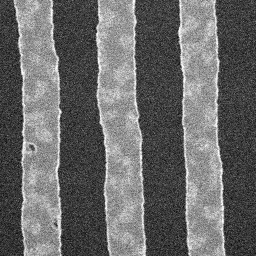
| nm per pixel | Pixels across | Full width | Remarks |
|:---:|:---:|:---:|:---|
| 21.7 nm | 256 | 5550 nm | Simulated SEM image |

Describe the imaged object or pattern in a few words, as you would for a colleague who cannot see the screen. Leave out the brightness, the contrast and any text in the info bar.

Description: one or a few lines or trenches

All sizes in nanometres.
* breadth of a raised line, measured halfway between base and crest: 753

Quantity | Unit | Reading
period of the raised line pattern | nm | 1750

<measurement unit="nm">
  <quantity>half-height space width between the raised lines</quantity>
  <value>972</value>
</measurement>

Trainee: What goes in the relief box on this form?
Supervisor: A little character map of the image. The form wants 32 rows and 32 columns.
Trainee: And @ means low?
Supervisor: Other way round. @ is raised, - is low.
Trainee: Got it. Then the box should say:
--@@@@------@@@@@------@@@@-----
--@@@@------@@@@@------@@@@-----
--@@@@-------@@@@------@@@@-----
--@@@@@-----@@@@@------@@@@-----
--@@@@------@@@@@-----@@@@@-----
--@@@@@-----@@@@@------@@@@-----
---@@@@-----@@@@@------@@@@-----
---@@@@-----@@@@@------@@@@-----
---@@@@-----@@@@@------@@@@-----
---@@@@-----@@@@@------@@@@-----
---@@@@-----@@@@@------@@@@-----
---@@@@-----@@@@@------@@@@-----
---@@@@-----@@@@@------@@@@-----
---@@@@-----@@@@@------@@@@-----
---@@@@------@@@@------@@@@-----
---@-@@------@@@@------@@@@-----
---@@@@------@@@@@-----@@@@-----
---@@@@------@@@@@-----@@@@-----
-----@@------@@@@@-----@@@@-----
---@@@@------@@@@@-----@@@@-----
---@@@@------@@@@@-----@@@@@----
---@@@@------@@@@@-----@@@@@----
---@@@@------@@@@@-----@@@@@----
---@@@@------@@@@@-----@@@@@----
---@@@@------@@@@@------@@@@----
---@@@@------@@@@@-----@@@@@----
---@@@@@-----@@@@@-----@@@@@----
---@@@-------@@@@@-----@@@@@----
---@@@@------@@@@@-----@@@@@----
---@@@@-------@@@@------@@@@----
---@@@@@------@@@@------@@@@----
---@@@@@------@@@-------@@@@----